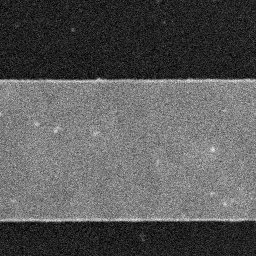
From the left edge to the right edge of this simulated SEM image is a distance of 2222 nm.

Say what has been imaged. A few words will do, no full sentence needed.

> one or a few lines or trenches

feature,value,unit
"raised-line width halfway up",1220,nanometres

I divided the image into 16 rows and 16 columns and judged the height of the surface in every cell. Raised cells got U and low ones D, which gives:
DDDDDDDDDDDDDDDD
DDDDDDDDDDDDDDDD
DDDDDDDDDDDDDDDD
DDDDDDDDDDDDDDDD
DDDDDDDDDDDDDDDD
UUUUUUUUUUUUUUUU
UUUUUUUUUUUUUUUU
UUUUUUUUUUUUUUUU
UUUUUUUUUUUUUUUU
UUUUUUUUUUUUUUUU
UUUUUUUUUUUUUUUU
UUUUUUUUUUUUUUUU
UUUUUUUUUUUUUUUU
UUUUUUUUUUUUUUUU
DDDDDDDDDDDDDDDD
DDDDDDDDDDDDDDDD